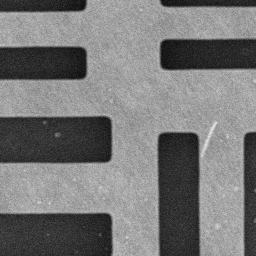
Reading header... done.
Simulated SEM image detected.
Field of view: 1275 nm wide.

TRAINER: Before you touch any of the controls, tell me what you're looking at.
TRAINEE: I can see groups of lines, slits or small figures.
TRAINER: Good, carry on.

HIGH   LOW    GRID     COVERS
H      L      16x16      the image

LLLLLHHHHHHHHHHH
HHHHHHHHHHHHHHHH
HHHHHHHHHHLLLLLL
LLLLLHHHHHLLLLLL
LLLLLHHHHHHHHHHH
HHHHHHHHHHHHHHHH
HHHHHHHHHHHHHHHH
LLLLLLLHHHHHHHHH
LLLLLLLHHHLLHHHL
LLLLLLLHHHLLLHHL
HHHHHHHHHHLLLHHL
HHHHHHHHHHLLLHHL
HHHHHHHHHHLLLHHL
LLLLLLLHHHLLLHHL
LLLLLLLHHHLLLHHL
LLLLLLLHHHLLLHHL